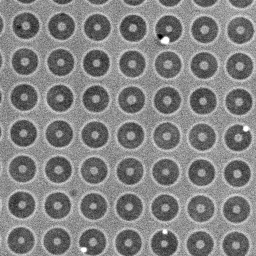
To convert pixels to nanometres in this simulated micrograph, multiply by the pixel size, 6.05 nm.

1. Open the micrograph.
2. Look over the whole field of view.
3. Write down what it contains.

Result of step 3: an array of small figures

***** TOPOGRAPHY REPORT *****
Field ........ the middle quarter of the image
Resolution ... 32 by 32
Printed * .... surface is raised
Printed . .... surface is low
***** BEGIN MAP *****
...**.......**.......**.......*.
..***......***......***......***
.*****....*****....****......***
*****************.*******..*****
********************************
.******..*******.***************
..***......****....*****....****
..***......***......***......***
...**.......*.......**.......**.
..***......**.......**.......**.
..***......***......***......***
.*****....*****....****.....****
*************************..*****
********************************
.*****...*******.********.******
..***......***.....****.....****
..**.......**.......***......***
..**.......**.......**.......**.
..**.......**.......**.......**.
..***......***......**.......**.
.*****....****.....****.....****
****************.********.******
********************************
******...*******.********.******
.****.....****.....****.....****
..**.......**.......**.......**.
..**.......**.......**.......**.
..**.......**.......**.......**.
.****.....***.......**.......**.
******....****.....****.....****
*************************.******
********************************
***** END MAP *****